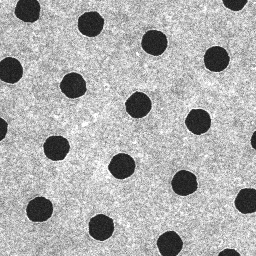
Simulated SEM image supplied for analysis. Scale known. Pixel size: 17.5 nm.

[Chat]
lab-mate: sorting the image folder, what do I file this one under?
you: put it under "a regular array of holes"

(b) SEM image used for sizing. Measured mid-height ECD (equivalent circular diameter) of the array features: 26.4 pixels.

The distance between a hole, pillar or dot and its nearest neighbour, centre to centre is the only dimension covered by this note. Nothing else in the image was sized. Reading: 1120 nm